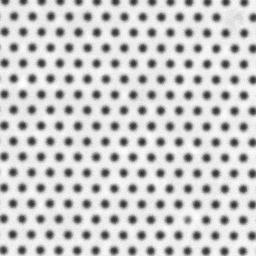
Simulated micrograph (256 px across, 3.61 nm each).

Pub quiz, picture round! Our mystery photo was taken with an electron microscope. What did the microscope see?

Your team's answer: a regular array of holes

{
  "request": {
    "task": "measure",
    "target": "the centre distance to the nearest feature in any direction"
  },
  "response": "0.0644 micrometres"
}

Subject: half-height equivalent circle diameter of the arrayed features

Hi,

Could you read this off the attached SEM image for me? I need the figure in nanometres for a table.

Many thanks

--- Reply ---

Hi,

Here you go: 33.8